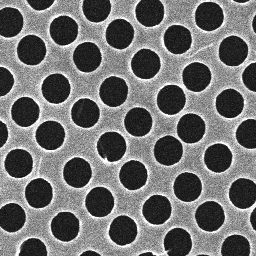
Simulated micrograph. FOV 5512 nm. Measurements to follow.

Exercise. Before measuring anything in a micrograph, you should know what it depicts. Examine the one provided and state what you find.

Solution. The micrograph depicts a regular array of holes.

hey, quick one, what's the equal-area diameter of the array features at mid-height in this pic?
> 642 nanometers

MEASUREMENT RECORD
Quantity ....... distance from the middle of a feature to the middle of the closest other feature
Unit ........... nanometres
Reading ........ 791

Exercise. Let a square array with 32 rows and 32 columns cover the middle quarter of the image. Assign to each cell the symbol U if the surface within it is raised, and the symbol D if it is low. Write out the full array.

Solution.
UUUDDDDDDUUUUUUUUDDDDDDDUUUUUUUD
UUUUDDDDUUUUUUUUUDDDDDDDUUUUUUDD
UUUUUUUUUUUUUUUUUDDDDDDUUUUUUUDD
DUUUUUUUUUUDDDUUUUUDDDUUUUUUUDDD
DUUUUUUUUUDDDDDUUUUUUUUUUUUUUUDD
DDUUUUUUUDDDDDDDUUUUUUUUUDDDDUDD
DDUUUUUUUDDDDDDDUUUUUUUUDDDDDDUD
DUUUUUUUUDDDDDDDUUUUUUUDDDDDDDUU
DUUUUDUUUDDDDDDDUUUUUUUDDDDDDDUU
UUUDDDDDUUDDDDDUUUUUUUUDDDDDDDDU
UUDDDDDDUUUDDDUUUUUUUUUDDDDDDDUU
UUDDDDDDDUUUUUUUDDDDDUUUDDDDDUUU
UUDDDDDDDUUUUUUUDDDDDDUUUDDDUUUD
UUDDDDDDDUUUUUUDDDDDDDUUUUUUUDDD
UUDDDDDDUUUUUUUDDDDDDDUUUUUUDDDD
UUUUDDDUUUUUUUUDDDDDDDUUUUUUDDDD
UUUUUUUUUUUUUUUUDDDDDDUUUUUUDDDD
UUUUUUUUUUDDDDUUUDDDDUUUUUUUDDDD
UUUUUUUUUDDDDDDUUUUUUUUUDDDDUDDD
UUUUUUUUDDDDDDDDUUUUUUUDDDDDDUDD
UUUUUUUUDDDDDDDDUUUUUUUDDDDDDDUU
UUUUUUUUDDDDDDDDUUUUUUDDDDDDDDUU
UUUUUUUUUDDDDDDUUUUUUUDDDDDDDDUU
UUDDDUUUUDDDDDUUUUUUUUUDDDDDDUUU
UDDDDDUUUUUDDUUUDDDUUUUDDDDDDUUU
DDDDDDDUUUUUUUDDDDDDUUUUUUUUUUUU
DDDDDDDUUUUUUUDDDDDDDUUUUUUUUUUU
DDDDDDDUUUUUUUDDDDDDDUUUUUUUUDDD
DDDDDDDUUUUUUUDDDDDDDUUUUUUUDDDD
DDDDDDUUUUUUUUDDDDDDDUUUUUUDDDDD
UDDDDUUUUUUUUUUDDDDDUUUUUUUDDDDD
UUUUUUUDDDDUUUUUDDUUUUUUUUUDDDDD